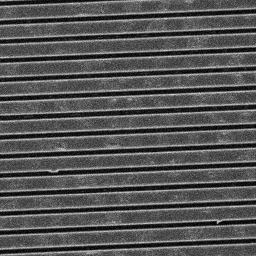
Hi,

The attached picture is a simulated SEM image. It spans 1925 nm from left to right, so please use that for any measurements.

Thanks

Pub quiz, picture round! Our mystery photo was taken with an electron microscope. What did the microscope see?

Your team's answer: parallel lines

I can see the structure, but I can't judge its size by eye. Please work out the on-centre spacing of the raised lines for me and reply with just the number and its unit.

144 nanometres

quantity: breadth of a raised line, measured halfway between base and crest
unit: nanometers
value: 104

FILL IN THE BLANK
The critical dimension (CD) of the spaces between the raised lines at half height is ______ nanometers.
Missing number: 38.5